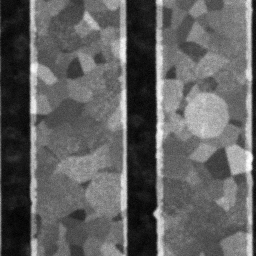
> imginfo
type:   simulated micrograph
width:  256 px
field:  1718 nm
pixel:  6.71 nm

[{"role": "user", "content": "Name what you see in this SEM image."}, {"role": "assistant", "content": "one or a few lines or trenches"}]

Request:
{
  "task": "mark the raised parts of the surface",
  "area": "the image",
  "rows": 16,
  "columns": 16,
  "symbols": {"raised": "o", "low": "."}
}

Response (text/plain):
..oooooo..oooooo
..oooooo..oooooo
..oooooo..oooooo
..oooooo..oooooo
..oooooo..oooooo
..oooooo..oooooo
..oooooo..oooooo
..oooooo..oooooo
..oooooo..oooooo
..oooooo..oooooo
..oooooo..oooooo
..oooooo..oooooo
..oooooo..oooooo
..oooooo..oooooo
..oooooo..oooooo
..oooooo..oooooo